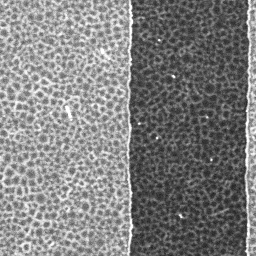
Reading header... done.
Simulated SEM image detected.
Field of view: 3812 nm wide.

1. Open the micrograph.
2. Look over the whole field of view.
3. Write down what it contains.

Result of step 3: one or a few lines or trenches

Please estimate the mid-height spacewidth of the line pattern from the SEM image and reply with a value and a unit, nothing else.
1770 nm